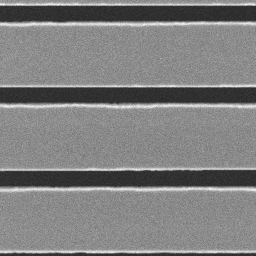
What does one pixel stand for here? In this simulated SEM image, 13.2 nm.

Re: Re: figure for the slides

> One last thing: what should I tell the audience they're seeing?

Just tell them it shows lines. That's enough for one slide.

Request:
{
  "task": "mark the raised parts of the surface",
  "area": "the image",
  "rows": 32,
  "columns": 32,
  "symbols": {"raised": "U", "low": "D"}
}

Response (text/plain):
UUUUUUUUUUUUUUUUUUUUUUUUUUUUUUUU
DDDDDDDDDDDDDDDDDDDDDDDDDDDDDDDD
DDDDDDDDDDDDDDDDDDDDDDDDDDDDDDDD
UUUUUUUUUUUUUUUUUUUUUUUUUUUUUUUU
UUUUUUUUUUUUUUUUUUUUUUUUUUUUUUUU
UUUUUUUUUUUUUUUUUUUUUUUUUUUUUUUU
UUUUUUUUUUUUUUUUUUUUUUUUUUUUUUUU
UUUUUUUUUUUUUUUUUUUUUUUUUUUUUUUU
UUUUUUUUUUUUUUUUUUUUUUUUUUUUUUUU
UUUUUUUUUUUUUUUUUUUUUUUUUUUUUUUU
UUUUUUUUUUUUUUUUUUUUUUUUUUUUUUUU
DDDDDDDDDDDDDDDDDDDDDDDDDDDDDDDD
DDDDDDDDDDDDDDDDDDDDDDDDDDDDDDDD
UUUUUUUUUUUUUUUUUUUUUUUUUUUUUUUU
UUUUUUUUUUUUUUUUUUUUUUUUUUUUUUUU
UUUUUUUUUUUUUUUUUUUUUUUUUUUUUUUU
UUUUUUUUUUUUUUUUUUUUUUUUUUUUUUUU
UUUUUUUUUUUUUUUUUUUUUUUUUUUUUUUU
UUUUUUUUUUUUUUUUUUUUUUUUUUUUUUUU
UUUUUUUUUUUUUUUUUUUUUUUUUUUUUUUU
UUUUUUUUUUUUUUUUUUUUUUUUUUUUUUUU
DDDDDDDDDDDDDDDDDDDDDDDDDDDDDDDD
DDDDDDDDDDDDDDDDDDDDDDDDDDDDDDDD
UUUUUUUUUUUUUUUUUUUUUUUUUUUUUUUU
UUUUUUUUUUUUUUUUUUUUUUUUUUUUUUUU
UUUUUUUUUUUUUUUUUUUUUUUUUUUUUUUU
UUUUUUUUUUUUUUUUUUUUUUUUUUUUUUUU
UUUUUUUUUUUUUUUUUUUUUUUUUUUUUUUU
UUUUUUUUUUUUUUUUUUUUUUUUUUUUUUUU
UUUUUUUUUUUUUUUUUUUUUUUUUUUUUUUU
UUUUUUUUUUUUUUUUUUUUUUUUUUUUUUUU
UUUUUUUUUUUUUUUUUUUUDUUUUUUUUUUU